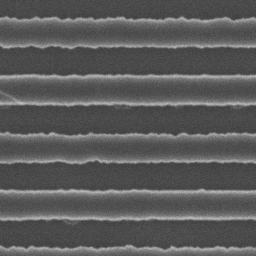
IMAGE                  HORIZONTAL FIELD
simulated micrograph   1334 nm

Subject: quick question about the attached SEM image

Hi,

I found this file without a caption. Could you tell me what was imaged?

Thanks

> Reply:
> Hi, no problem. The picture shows lines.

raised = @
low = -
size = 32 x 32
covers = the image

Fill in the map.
--------------------------------
--------------------------------
@@-@@@@@@@@@@@@@@@@-@@@@@-@@@-@@
@@@@@@@@@@@@@@@@@@@@@@@@@@@@@@@@
@@@@@@@@@@@@@@@@@@@@@@@@@@@@@@@@
@@@@@@@@@@@@@@@@@@@@@@@@@@@@@@@@
--------------------------------
--------------------------------
--------------------------------
-@@@@@@@-@@@@@@@@@@@@@@@@@@@@@@@
@@@@@@@@@@@@@@@@@@@@@@@@@@@@@@@@
@@@@@@@@@@@@@@@@@@@@@@@@@@@@@@@@
@@@@@@@@@@@@@@@@@@@@@@@@@@@@@@@@
--------------------------------
--------------------------------
--------------------------------
--------------------------------
@@@@@@@@@@@@@@@@@@@@@@@@@@@@@@@@
@@@@@@@@@@@@@@@@@@@@@@@@@@@@@@@@
@@@@@@@@@@@@@@@@@@@@@@@@@@@@@@@@
--------------------------------
--------------------------------
--------------------------------
--------------------------------
@@@@@@@@@@@@@@@@@@@@@@@@@@@@@@@@
@@@@@@@@@@@@@@@@@@@@@@@@@@@@@@@@
@@@@@@@@@@@@@@@@@@@@@@@@@@@@@@@@
--------------@-----------------
--------------------------------
--------------------------------
--------------------------------
@@@@@@@@@@@@@@@@@@@@@@@@@@@@@@@@